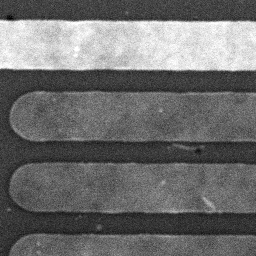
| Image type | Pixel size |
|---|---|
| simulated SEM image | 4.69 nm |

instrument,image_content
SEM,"groups of lines, slits or small figures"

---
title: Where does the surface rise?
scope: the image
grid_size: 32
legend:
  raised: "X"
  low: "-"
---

--------------------------------
--------------------------------
--------------------------------
XXXXXXXXXXXXXXXXXXXXXXXXXXXXXXXX
XXXXXXXXXXXXXXXXXXXXXXXXXXXXXXXX
XXXXXXXXXXXXXXXXXXXXXXXXXXXXXXXX
XXXXXXXXXXXXXXXXXXXXXXXXXXXXXXXX
XXXXXXXXXXXXXXXXXXXXXXXXXXXXXXXX
--------XXXX----XXXXXXXXXXXXXXXX
--------------------------------
--------------------------------
--------------------------------
--XXXXXXXXXXXXXXXXXXXXXXXXXXXXXX
--XXXXXXXXXXXXXXXXXXXXXXXXXXXXXX
-XXXXXXXXXXXXXXXXXXXXXXXXXXXXXXX
-XXXXXXXXXXXXXXXXXXXXXXXXXXXXXXX
--XXXXXXXXXXXXXXXXXXXXXXXXXXXXXX
----XX-------XXXXXX-XXXXXXXXXX-X
--------------------------------
--------------------------------
--------X-----------------------
--XXXXXXXXXXXXXXXXXXXXXXXXXXXXXX
-XXXXXXXXXXXXXXXXXXXXXXXXXXXXXXX
-XXXXXXXXXXXXXXXXXXXXXXXXXXXXXXX
--XXXXXXXXXXXXXXXXXXXXXXXXXXXXXX
--XXXXXXXXXXXXXXXXXXXXXXXXXXXXXX
-----------------------------XX-
--------------------------------
--------------------------------
----XXXXXXXXX-XXXXXX------------
--XXXXXXXXXXXXXXXXXXXXXXXXXXXXXX
-XXXXXXXXXXXXXXXXXXXXXXXXXXXXXXX